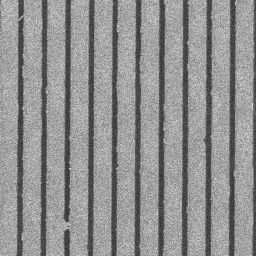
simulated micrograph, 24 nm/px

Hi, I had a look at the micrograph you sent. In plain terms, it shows parallel lines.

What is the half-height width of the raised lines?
0.423 microns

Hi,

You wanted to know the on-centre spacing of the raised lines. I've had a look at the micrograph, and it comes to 564 nm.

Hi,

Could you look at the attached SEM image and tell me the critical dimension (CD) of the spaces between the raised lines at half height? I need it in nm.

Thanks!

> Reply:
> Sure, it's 141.